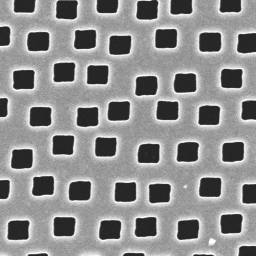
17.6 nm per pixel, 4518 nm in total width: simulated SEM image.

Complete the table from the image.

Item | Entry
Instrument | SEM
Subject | a regular array of holes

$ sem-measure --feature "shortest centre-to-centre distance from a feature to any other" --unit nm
636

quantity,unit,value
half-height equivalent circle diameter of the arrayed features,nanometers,400